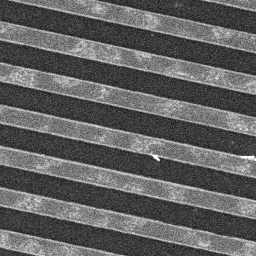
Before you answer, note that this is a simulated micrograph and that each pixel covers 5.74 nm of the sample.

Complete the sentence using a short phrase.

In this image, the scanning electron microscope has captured parallel lines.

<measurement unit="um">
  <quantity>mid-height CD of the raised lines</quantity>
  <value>0.0975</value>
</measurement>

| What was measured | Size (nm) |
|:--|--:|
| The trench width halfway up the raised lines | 135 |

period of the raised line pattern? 233 nanometres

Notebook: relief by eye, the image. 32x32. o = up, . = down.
....oooooooooo..............oooo
........oooooooooo..............
.............oooooooooo.........
oooo..............oooooooooo....
ooooooooo.............oooooooooo
...oooooooooo..............ooooo
.......ooooooooooo..............
............oooooooooo..........
ooo..............oooooooooo.....
ooooooo..............ooooooooooo
..oooooooooo..............oooooo
.......oooooooooo..............o
...........oooooooooo...........
oo..............oooooooooo......
oooooo...............oooooooooo.
.oooooooooo..............ooooooo
.....ooooooooooo..............oo
..........oooooooooo............
o..............oooooooooo.......
ooooo..............ooooooooooo..
oooooooooo..............oooooooo
....ooooooooooo..............ooo
.........oooooooooo.............
..............oooooooooo........
oooo..............ooooooooooo...
ooooooooo..............ooooooooo
....oooooooooo..............oooo
........ooooooooooo.............
.............oooooooooo.........
oooo..............oooooooooo....
oooooooo..............oooooooooo
...oooooooooo..............ooooo